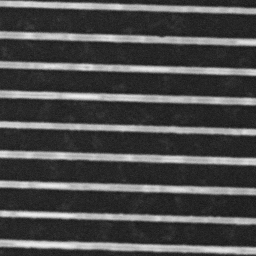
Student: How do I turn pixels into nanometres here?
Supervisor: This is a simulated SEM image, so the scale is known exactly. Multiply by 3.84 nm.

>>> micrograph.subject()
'parallel lines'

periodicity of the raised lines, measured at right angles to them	115	nm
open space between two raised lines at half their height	90.1	nm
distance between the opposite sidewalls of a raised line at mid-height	23.5	nanometres